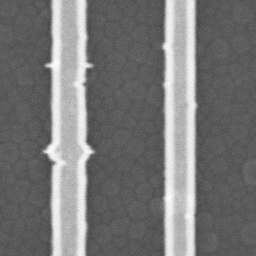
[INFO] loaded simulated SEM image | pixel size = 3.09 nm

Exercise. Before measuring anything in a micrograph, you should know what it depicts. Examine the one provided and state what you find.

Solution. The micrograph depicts one or a few lines or trenches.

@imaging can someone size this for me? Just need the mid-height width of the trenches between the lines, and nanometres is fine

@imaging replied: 269